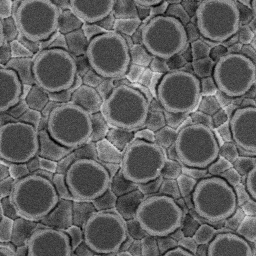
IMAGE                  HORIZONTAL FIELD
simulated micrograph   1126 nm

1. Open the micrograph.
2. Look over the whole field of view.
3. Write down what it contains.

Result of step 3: a regular array of raised bodies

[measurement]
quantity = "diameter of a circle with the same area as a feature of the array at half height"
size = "174 nm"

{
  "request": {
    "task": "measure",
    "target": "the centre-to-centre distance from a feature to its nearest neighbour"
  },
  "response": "246 nm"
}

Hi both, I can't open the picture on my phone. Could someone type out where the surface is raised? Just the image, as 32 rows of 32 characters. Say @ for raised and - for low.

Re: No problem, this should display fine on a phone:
---@@@---@@@@@-----------@@@@---
--@@@@@---@@@@-----------@@@@@--
--@@@@@----@-------@@@---@@@@@--
---@@@@-----------@@@@@--@@@@---
---@@@-------@@---@@@@@---@@@---
-----------@@@@@--@@@@@---------
------@@---@@@@@---@@@----------
-----@@@@--@@@@@------------@@@-
----@@@@@---@@@@-----------@@@@@
@@---@@@@------------@@@---@@@@@
@@---@@@@-----------@@@@@--@@@@-
@@------------@@@---@@@@@---@@--
@@------------@@@@--@@@@--------
@------@@@---@@@@@---@@@--------
------@@@@@---@@@@------------@@
-@@---@@@@@----@@------------@@@
@@@@--@@@@@------------@@@---@@@
@@@@---@@@@-----------@@@@@--@@@
@@@@@-----------@@@@--@@@@@----@
@@@@------------@@@@---@@@@-----
---------@@@----@@@@----@@------
---------@@@@---@@@@-----------@
---@@@---@@@@---@@@------------@
--@@@@@--@@@@------------@@@@--@
--@@@@@---@@------------@@@@@---
--@@@@@-----------@@@@---@@@@---
---@@@-----------@@@@@@--@@@@---
-----------@@@@--@@@@@----------
-----------@@@@---@@@@----------
----@@@@---@@@@@------------@---
----@@@@---@@@@------------@@@@-
@---@@@@@------------@@---@@@@@-